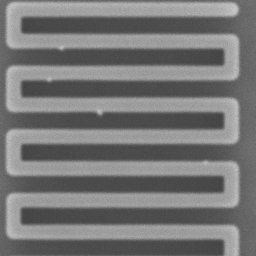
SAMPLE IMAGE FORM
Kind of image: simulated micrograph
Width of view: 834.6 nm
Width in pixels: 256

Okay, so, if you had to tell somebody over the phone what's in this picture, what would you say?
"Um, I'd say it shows groups of lines, slits or small figures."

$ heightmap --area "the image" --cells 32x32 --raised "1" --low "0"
01111111111111111111111111111000
01111111111111111111111111111100
01100000000000000000000000000000
01000000000000000000000000000000
01111111111111111111111111111000
01111111111111111111111111111100
00000000000000000000000000001100
00000000000000000000000000001100
01111111111111111111111111111100
01111111111111111111111111111100
01100000000000000000000000000000
01000000000000000000000000000000
01111111111111111111111111111000
01111111111111111111111111111100
00000000000000000000000000001100
00000000000000000000000000001100
01111111111111111111111111111100
01111111111111111111111111111100
01100000000000000000000000000000
01000000000000000000000000000000
01111111111111111111111111111000
01111111111111111111111111111100
00000000000000000000000000001100
00000000000000000000000000001100
01111111111111111111111111111100
01111111111111111111111111111100
01000000000000000000000000000000
01000000000000000000000000000000
01111111111111111111111111111000
01111111111111111111111111111100
00000000000000000000000000001100
00000000000000000000000000001100